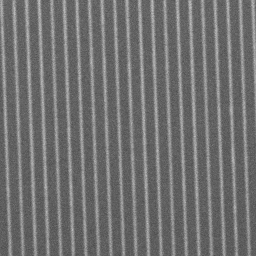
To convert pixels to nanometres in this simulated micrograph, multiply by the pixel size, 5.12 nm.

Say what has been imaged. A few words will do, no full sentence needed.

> parallel lines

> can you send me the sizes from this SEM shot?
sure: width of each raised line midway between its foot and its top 12.8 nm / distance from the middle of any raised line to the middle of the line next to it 64.4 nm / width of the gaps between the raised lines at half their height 0.0525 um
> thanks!